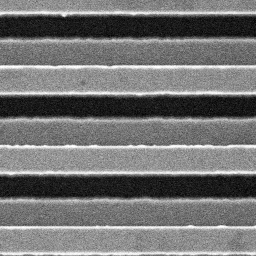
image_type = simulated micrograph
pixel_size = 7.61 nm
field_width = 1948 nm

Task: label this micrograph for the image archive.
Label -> lines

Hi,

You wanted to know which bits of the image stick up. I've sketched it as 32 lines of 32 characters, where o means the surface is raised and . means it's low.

oooooooooooooooooooooooooooooooo
oooooooooooooooooooooooooooooooo
................................
................................
................................
oooooooooooooooooooooooooooooooo
oooooooooooooooooooooooooooooooo
oooooooooooooooooooooooooooooooo
oooooooooooooooooooooooooooooooo
oooooooooooooooooooooooooooooooo
oooooooooooooooooooooooooooooooo
oooooooooooooooooooooooooooooooo
................................
................................
................................
oooooooooooooooooooooooooooooooo
oooooooooooooooooooooooooooooooo
oooooooooooooooooooooooooooooooo
oooooooooooooooooooooooooooooooo
oooooooooooooooooooooooooooooooo
oooooooooooooooooooooooooooooooo
oooooooooooooooooooooooooooooooo
................................
................................
................................
oooooooooooooooooooooooooooooooo
oooooooooooooooooooooooooooooooo
oooooooooooooooooooooooooooooooo
oooooooooooooooooooooooooooooooo
oooooooooooooooooooooooooooooooo
oooooooooooooooooooooooooooooooo
oooooooooooooooooooooooooooooooo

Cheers